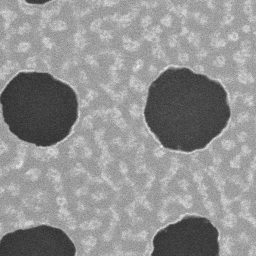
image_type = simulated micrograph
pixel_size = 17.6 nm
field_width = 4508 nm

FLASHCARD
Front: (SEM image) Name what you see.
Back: holes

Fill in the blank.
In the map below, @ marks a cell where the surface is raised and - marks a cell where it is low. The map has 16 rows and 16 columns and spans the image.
@@@@@@@@@@@@@@@@
@@@@@@@@@@@@@@@@
@@@@@@@@@@@@@@@@
@@@@@@@@@@@@@@@@
@@-@@@@@@@--@@@@
----@@@@@-----@@
-----@@@@-----@@
-----@@@@-----@@
@---@@@@@@----@@
@@@@@@@@@@@@@@@@
@@@@@@@@@@@@@@@@
@@@@@@@@@@@@@@@@
@@@@@@@@@@@@@@@@
@@@@@@@@@@@@@@@@
@---@@@@@@----@@
-----@@@@@----@@